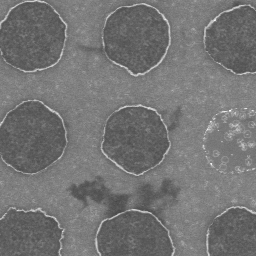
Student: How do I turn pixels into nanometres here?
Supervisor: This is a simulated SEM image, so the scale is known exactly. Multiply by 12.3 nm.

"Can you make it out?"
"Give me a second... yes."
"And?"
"raised bodies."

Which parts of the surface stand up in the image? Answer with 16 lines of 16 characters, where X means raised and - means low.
-XX-----XX-----X
XXXX---XXX---XXX
XXXX--XXXXX--XXX
XXXX---XXX---XXX
--------X------X
----------------
-XX-------------
XXXX---XXX------
XXXX--XXXXX-----
XXXX--XXXX------
-XX-----XX------
----------------
----------------
XXX----XXX----XX
XXXX--XXXX---XXX
XXXX--XXXXX--XXX